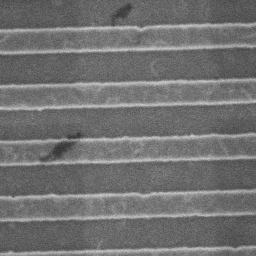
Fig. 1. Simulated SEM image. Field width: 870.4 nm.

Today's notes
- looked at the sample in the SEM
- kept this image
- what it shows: parallel lines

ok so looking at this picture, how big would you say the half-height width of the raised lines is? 23.6 px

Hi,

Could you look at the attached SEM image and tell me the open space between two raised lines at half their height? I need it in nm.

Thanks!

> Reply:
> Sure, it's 109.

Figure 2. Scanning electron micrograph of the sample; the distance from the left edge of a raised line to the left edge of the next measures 190 nm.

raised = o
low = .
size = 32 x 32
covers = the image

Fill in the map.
................................
................................
................................
...........oooooo.oooooooooooooo
oooooooooooooooooooooooooooooooo
oooooooooooooooooooooooooooooooo
ooooo...........................
................................
................................
................................
..........oooooooooooooooooooooo
oooooooooooooooooooooooooooooooo
oooooooooooooooooooooooooooooooo
oooooooo........................
................................
................................
................................
......oooooooooooooooooooooooooo
oooooooooooooooooooooooooooooooo
oooooooooooooooooooooooooooooooo
oooo............................
................................
................................
................................
.....oo.oooooooooooooooooooooooo
oooooooooooooooooooooooooooooooo
oooooooooooooooooooooooooooooooo
oooo.o..........................
................................
................................
................................
.......ooooooooooooooooooooooooo